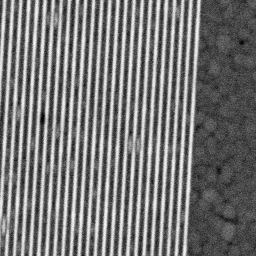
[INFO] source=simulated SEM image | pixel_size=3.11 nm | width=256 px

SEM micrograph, parallel lines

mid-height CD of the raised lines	0.0039	microns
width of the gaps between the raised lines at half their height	0.0198	µm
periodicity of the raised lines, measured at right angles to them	25.1	nm